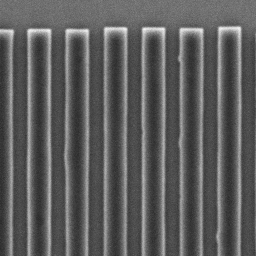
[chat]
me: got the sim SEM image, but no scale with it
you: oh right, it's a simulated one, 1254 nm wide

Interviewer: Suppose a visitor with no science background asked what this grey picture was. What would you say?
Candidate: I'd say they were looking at parallel lines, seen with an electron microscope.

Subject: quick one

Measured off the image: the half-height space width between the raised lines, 78.4 nanometres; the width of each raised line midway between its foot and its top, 108 nm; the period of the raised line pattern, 187 nm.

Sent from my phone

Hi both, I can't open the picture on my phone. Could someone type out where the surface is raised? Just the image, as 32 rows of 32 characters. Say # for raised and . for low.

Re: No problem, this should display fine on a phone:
................................
................................
................................
............................##..
##..##..###..###..##...##..###..
#...##..###..###..##...##..###..
#...##..###..###..###..##..###..
#...##..###..###..##..###..###..
#...##..###..###..###..##..###..
#...##..###..###..###..##..###..
#...##..###..###..###..##..###..
#...##..###..###..###..##..###..
#...##..###..###..###..##..###..
#...##..###..###..###..##..###..
#...##..###..###..###..##..###..
#...##..###..###..###..##..###..
#...##..###..###..###..##..###..
#...##..###..###..###..##..###..
#...##..###..###..###..##..###..
#...##..###..###..##...##..###..
#...##..###..###..##...##..###..
#...##..###..###..##...##..###..
#...##..###..###..##...##..###..
#...##..###..###..##...##..###..
#...##..###..###..##...##..###..
#...##..###..###..##...##..###..
#...##..###..###..##...##..###..
#...##..###..###..##...##..###..
#...##..###..###..###..##..###..
#...##..###..###..###..##..###..
#...##..###..###..###..##..###..
#...##..###..###..###..##..###..